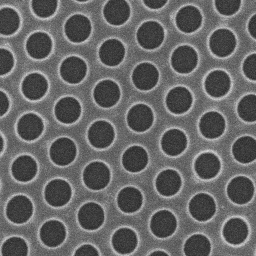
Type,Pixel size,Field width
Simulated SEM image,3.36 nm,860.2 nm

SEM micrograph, a regular array of holes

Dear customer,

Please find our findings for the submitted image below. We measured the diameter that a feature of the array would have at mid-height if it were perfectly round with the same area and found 94 nanometres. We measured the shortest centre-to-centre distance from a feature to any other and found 0.138 micrometres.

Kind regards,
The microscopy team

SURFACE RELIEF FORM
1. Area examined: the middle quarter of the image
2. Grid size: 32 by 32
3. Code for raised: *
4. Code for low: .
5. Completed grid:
......*****..*****.....****.....
......***********......*****....
......***********.......******.*
.....************.......********
....*****....****......*********
********......****.....*********
*******.......*****..*****.....*
*******.......************......
...****.......***********.......
....****.....************.......
....*****....****....*****......
....************......****.....*
....************......*****...**
....************......**********
...*****...*****......**********
******......****......**********
******.......****....*****...***
******.......************.....**
.*****.......***********.......*
...***......************.......*
...****....******..*****.......*
...************.....*****.....**
...************......****....***
...***********.......***********
..*****...****.......***********
******.....****......***********
*****......*****....*****...****
*****.......************.....***
*****.......***********......***
.****......************......***
..****.....************......***
..*****..*****.....****......***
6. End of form